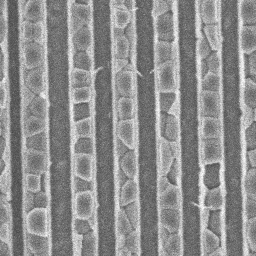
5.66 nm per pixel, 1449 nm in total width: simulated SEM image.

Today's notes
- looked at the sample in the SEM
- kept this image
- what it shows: parallel lines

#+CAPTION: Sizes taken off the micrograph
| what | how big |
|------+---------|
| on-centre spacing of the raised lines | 248 nanometers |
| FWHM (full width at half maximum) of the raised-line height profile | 136 nanometers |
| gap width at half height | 107 nanometers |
